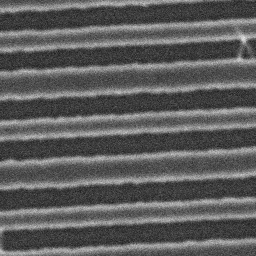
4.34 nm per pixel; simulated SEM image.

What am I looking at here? lines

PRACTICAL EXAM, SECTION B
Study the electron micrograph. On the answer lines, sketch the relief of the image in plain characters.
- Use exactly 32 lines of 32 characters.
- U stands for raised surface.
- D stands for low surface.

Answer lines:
UUUUUUUUUUUUUUUUUUUDDDDDDDDDDDDD
DDDDDDDDDDDDDDDDDDDDDDDDDDDDDDDD
DDDDDDDDDDDDDDDDDDDDDDDDDDDDDDDU
DDDDDDDDDDDUUUUUUUUUUUUUUUUUUUUU
UUUUUUUUUUUUUUUUUUUUUUUUUUUUUUUU
UUUUUUUUUUUUUUUUUUUDDDDDDDDDDDDD
DDDDDDDDDDDDDDDDDDDDDDDDDDDDDDDD
DDDDDDDDDDDDDDDDDDDDDDDDDDDDUUUU
DDDDDDDDDDDUUUUUUUUUUUUUUUUUUUUU
UUUUUUUUUUUUUUUUUUUUUUUUUUUUUUUU
UUUUUUUUUUUUUUUUUUUUUUUUUUUUUUUU
UUUUUUUUUUUUUUUUUUUUDUDDDDDDDDDD
DDDDDDDDDDDDDDDDDDDDDDDDDDDDDDDD
DDDDDDDDDDDDDDDDDDDDDDDDDDDDDDDD
DDDDDDDDDDDDDUUUUUUUUUUUUUUUUUUU
UUUUUUUUUUUUUUUUUUUUUUUUUUUUUUUU
UUUUUUUUUUUUUUUUUUDDDDDDDDDDDDDD
UDDDDDDDDDDDDDDDDDDDDDDDDDDDDDDD
DDDDDDDDDDDDDDDDDDDDDDDDDDDDDDDD
DDDDDDDDDDDDDDUUUUUUUUUUUUUUUUUU
UUUUUUUUUUUUUUUUUUUUUUUUUUUUUUUU
UUUUUUUUUUUUUUUUUUUUUUUUUUUUUUUU
UUUUUUUUUUUUUUUUUUUUUDDDDDDDDDDD
UUDUDDDDDDDDDDDDDDDDDDDDDDDDDDDD
DDDDDDDDDDDDDDDDDDDDDDDDDDDDDDDD
DDDDDDDDDDDDDDDDDUUUUUUUUUUUUUUU
DUUUUUUUUUUUUUUUUUUUUUUUUUUUUUUU
UUUUUUUUUUUUUUUUUUUUUUUDDDDDDDDD
UUDDDDDDDDDDDDDDDDDDDDDDDDDDDDDD
DDDDDDDDDDDDDDDDDDDDDDDDDDDDDDDD
DDDDDDDDDDDDDDDDDDDUUUUUUUUUUUUU
UDUUUUUUUUUUUUUUUUUUUUUUUUUUUUUU